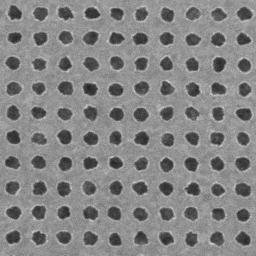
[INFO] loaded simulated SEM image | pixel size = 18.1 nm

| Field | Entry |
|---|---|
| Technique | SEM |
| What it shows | a regular array of holes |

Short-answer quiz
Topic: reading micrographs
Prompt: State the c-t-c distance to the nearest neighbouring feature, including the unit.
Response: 439 nm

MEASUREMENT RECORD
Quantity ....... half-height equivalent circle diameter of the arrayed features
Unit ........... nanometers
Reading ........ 266